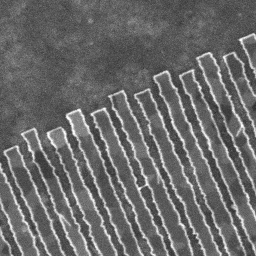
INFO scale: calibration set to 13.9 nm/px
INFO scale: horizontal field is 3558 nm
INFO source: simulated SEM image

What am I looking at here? parallel lines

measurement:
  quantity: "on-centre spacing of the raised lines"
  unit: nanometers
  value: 329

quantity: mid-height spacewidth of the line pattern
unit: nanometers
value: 128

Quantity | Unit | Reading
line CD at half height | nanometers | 201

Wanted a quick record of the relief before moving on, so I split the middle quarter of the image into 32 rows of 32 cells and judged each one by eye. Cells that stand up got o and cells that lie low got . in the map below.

................................
................................
........................oo....oo
.......................oooo..ooo
.......................oooo...oo
........................ooo...oo
........................oooo..oo
.............oo...oooo..oooo...o
............ooo...oooo...oooo...
............oooo...oooo..oooo...
............oooo...oooo...ooo...
.........o...oooo...ooo...oooo..
.ooo...oooo..oooo...oooo...ooo..
.oooo...ooo...oooo...ooo...oooo.
..ooo...oooo..oooo...oooo..oooo.
..oooo..oooo...oooo..oooo..ooooo
..oooo...oooo..oooo..ooooo..oooo
...oooo..oooo...ooo...oooo...ooo
...oooo...ooo...oooo...ooo...ooo
o...ooo...oooo...ooo...oooo...oo
o...oooo...ooo...oooo..oooo...oo
oo..ooooo..oooo..oooo...ooo...oo
oo...oooo..oooo...ooo...oooo...o
oo...oooo...oooo..oooo..oooo...o
ooo...oooo..oooo...ooo...oooo...
ooo...oooo..oooo...oooo..ooooo..
ooo....ooo...oooo..oooo..ooooo..
.ooo...oooo..oooo...oooo..oooo..
.ooo....ooo...oooo..oooo...oooo.
..ooo...oooo..oooo...oooo..oooo.
..ooo...oooo...ooo...oooo..ooooo
..oooo...oooo..oooo...oooo..oooo